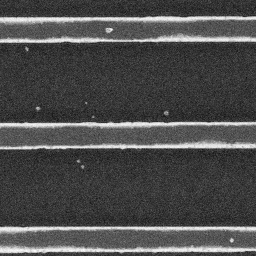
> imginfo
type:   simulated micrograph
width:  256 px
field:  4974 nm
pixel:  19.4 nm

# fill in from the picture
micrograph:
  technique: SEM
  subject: lines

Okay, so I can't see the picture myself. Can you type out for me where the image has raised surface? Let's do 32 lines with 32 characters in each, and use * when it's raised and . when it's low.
................................
................................
********************************
********************************
********************************
................................
................................
................................
................................
................................
................................
................................
................................
................................
................................
********************************
********************************
********************************
*******.........................
................................
................................
................................
................................
................................
................................
................................
................................
................................
*..*****************************
********************************
********************************
.*..............................